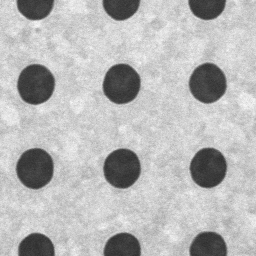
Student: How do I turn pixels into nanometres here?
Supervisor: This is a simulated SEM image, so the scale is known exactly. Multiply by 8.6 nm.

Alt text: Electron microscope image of holes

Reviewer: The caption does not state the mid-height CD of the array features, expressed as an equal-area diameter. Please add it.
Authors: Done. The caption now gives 39.7 px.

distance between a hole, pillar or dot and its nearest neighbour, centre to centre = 726 nm